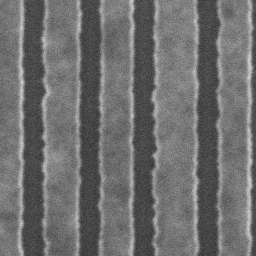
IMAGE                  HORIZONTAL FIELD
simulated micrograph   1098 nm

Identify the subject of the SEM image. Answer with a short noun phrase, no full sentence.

lines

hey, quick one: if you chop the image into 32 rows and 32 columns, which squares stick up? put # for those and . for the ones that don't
###...####...####..#####...####.
###...####...####..######..####.
###...####...####..######...###.
###...####...####..######...###.
###..#####...####..######..####.
###..#####...####..######..####.
###..#####...####..######..####.
###..#####...####..######..####.
###...####...####..#####...####.
###...####...####...#####..####.
###...####...####...#####...###.
###...####...###...######..####.
###..#####...####..######..####.
###..#####...####..#####...####.
###..#####...####..######...###.
###...####...####..######..####.
###...####..#####..#####...####.
###...####...###....#####..####.
###...####..#####...#####..####.
###...####..#####..######..####.
###...####...####...#####..####.
###...####...####..#####...####.
###...####...####..######..####.
###..#####...####..######..####.
###...####...####..######..####.
###...####..####...######..####.
###...####...###....#####..####.
###...####...####..######..####.
###...####...####..######..####.
###..#####...####..######..####.
###...####..#####..######..####.
###...####..#####..######..####.